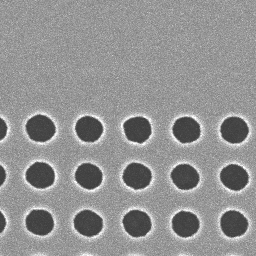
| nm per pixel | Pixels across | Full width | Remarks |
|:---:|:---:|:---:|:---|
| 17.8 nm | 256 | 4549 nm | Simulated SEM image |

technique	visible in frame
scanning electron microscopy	a regular array of holes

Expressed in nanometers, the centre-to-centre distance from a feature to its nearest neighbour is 835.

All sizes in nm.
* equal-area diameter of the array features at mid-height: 501